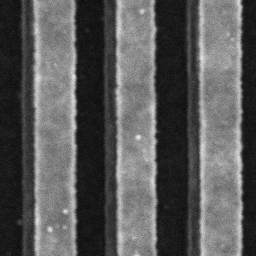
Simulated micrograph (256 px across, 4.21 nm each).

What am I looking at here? lines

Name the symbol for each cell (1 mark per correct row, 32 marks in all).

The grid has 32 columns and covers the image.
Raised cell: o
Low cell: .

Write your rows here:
....ooooo....oooooo.....oooooo..
....ooooo....oooooo......ooooo..
....ooooo....oooooo......ooooo..
....ooooo....ooooooo.....ooooo..
....ooooo....oooooo......ooooo..
....ooooo....oooooo......ooooo..
...ooooooo...oooooo......ooooo..
....oooooo...oooooo......ooooo..
....ooooo.....ooooo......ooooo..
....ooooo.....ooooo......ooooo..
....ooooo.....ooooo.....oooooo..
....ooooo.....ooooo.....oooooo..
....oooooo....ooooo......ooooo..
....oooooo....ooooo......ooooo..
....ooooo....oooooo......ooooo..
....oooooo...oooooo.....oooooo..
....ooooo....oooooo....ooooooo..
...oooooo....oooooo.....oooooo..
...ooooooo...oooooo.....oooooo..
...ooooooo...oooooo.....oooooo..
....oooooo...oooooo.....oooooo..
...ooooooo...ooooooo....oooooo..
...ooooooo....ooooo.....oooooo..
...ooooooo....ooooo.....oooooo..
...ooooooo...ooooooo....oooooo..
...ooooooo...ooooooo....oooooo..
...ooooooo...oooooo.....oooooo..
...ooooooo...oooooo......ooooo..
...ooooooo...oooooo......ooooo..
....oooooo...ooooooo.....ooooo..
....oooooo...oooooo......ooooo..
...ooooooo...ooooooo.....ooooo..